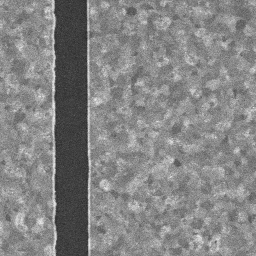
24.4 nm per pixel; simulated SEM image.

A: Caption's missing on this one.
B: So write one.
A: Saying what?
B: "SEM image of one or a few lines or trenches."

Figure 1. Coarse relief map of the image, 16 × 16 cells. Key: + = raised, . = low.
+++...++++++++++
+++...++++++++++
+++...++++++++++
+++...++++++++++
+++...++++++++++
+++...++++++++++
+++...++++++++++
+++...++++++++++
+++...++++++++++
+++...++++++++++
+++...++++++++++
+++...++++++++++
+++...++++++++++
+++...++++++++++
+++...++++++++++
+++...++++++++++